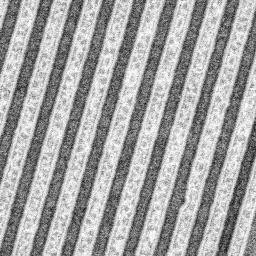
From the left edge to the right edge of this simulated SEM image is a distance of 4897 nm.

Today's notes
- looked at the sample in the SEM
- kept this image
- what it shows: parallel lines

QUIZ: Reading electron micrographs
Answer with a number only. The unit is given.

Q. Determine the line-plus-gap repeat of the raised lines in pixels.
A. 29.8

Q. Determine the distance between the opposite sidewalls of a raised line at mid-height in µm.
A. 0.285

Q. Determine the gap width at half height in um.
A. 0.285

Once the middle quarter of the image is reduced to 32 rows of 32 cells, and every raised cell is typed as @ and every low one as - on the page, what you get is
-@@@-----@@@----@@@@----@@@@----
-@@@----@@@@----@@@@----@@@-----
@@@@----@@@@----@@@----@@@@----@
@@@@----@@@----@@@@----@@@@----@
@@@@---@@@@----@@@@----@@@@----@
@@@----@@@@----@@@-----@@@----@@
@@@----@@@@----@@@----@@@@----@@
@@-----@@@----@@@@----@@@@----@@
@@----@@@@----@@@@----@@@-----@@
@@----@@@@----@@@-----@@@----@@@
@@----@@@----@@@@----@@@@----@@@
@----@@@@----@@@@----@@@@----@@@
@----@@@@----@@@@----@@@----@@@@
@----@@@-----@@@----@@@@----@@@@
-----@@@----@@@@----@@@@----@@@@
----@@@@----@@@@----@@@-----@@@-
----@@@@----@@@----@@@@----@@@@-
----@@@----@@@@----@@@@----@@@@-
---@@@@----@@@@----@@@@----@@@--
---@@@@----@@@@----@@@----@@@@--
---@@@@---@@@@----@@@@----@@@@--
---@@@----@@@@----@@@@----@@@@--
--@@@@----@@@@----@@@@----@@@---
--@@@@----@@@@---@@@@----@@@@---
--@@@----@@@@----@@@@----@@@@---
-@@@@----@@@@----@@@@----@@@----
-@@@@----@@@@----@@@----@@@@----
-@@@@----@@@----@@@@----@@@@----
-@@@----@@@@----@@@@----@@@@----
@@@@----@@@@----@@@----@@@@----@
@@@@----@@@----@@@@----@@@@----@
@@@----@@@@----@@@@----@@@@----@